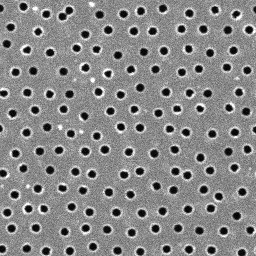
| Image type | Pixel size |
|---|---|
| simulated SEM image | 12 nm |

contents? a regular array of holes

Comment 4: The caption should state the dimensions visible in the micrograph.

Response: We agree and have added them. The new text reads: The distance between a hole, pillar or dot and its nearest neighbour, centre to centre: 18.9 pixels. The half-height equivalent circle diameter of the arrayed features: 0.0992 microns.